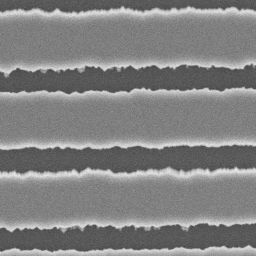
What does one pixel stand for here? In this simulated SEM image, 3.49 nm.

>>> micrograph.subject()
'lines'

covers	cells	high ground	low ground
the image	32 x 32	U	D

DDDDDDDDDDDDDDDDDDDDDDDDDDDDDDDD
DUUUUDDUDDDUUUUUUDUUUUUUUUUUUUUU
UUUUUUUUUUUUUUUUUUUUUUUUUUUUUUUU
UUUUUUUUUUUUUUUUUUUUUUUUUUUUUUUU
UUUUUUUUUUUUUUUUUUUUUUUUUUUUUUUU
UUUUUUUUUUUUUUUUUUUUUUUUUUUUUUUU
UUUUUUUUUUUUUUUUUUUUUUUUUUUUUUUU
UUUUUUUUUUUUUUUUUUUUUUUUUUUUUUUU
UUUUUUUUUUDDDUDDDDDDDDDDDDDDDUDD
DDDDDDDDDDDDDDDDDDDDDDDDDDDDDDDD
DDDDDDDDDDDDDDDDDDDDDDDDDDDDDDDD
DDDDUUDUDDDUUUDUUUUUUUUUUUUUUUUU
UUUUUUUUUUUUUUUUUUUUUUUUUUUUUUUU
UUUUUUUUUUUUUUUUUUUUUUUUUUUUUUUU
UUUUUUUUUUUUUUUUUUUUUUUUUUUUUUUU
UUUUUUUUUUUUUUUUUUUUUUUUUUUUUUUU
UUUUUUUUUUUUUUUUUUUUUUUUUUUUUUUU
UUUUUUUUUUUUUUUUUUUUUUUUUUUUUUUU
UUUDDUDDDUUDUDDDDDDUDDDDDDDDDDDD
DDDDDDDDDDDDDDDDDDDDDDDDDDDDDDDD
DDDDDDDDDDDDDDDDDDDDDDDDDDDDDDDD
DDDDDDDDDUUUUUDDDUUUUUDDUUUUUUUU
UUUUUUUUUUUUUUUUUUUUUUUUUUUUUUUU
UUUUUUUUUUUUUUUUUUUUUUUUUUUUUUUU
UUUUUUUUUUUUUUUUUUUUUUUUUUUUUUUU
UUUUUUUUUUUUUUUUUUUUUUUUUUUUUUUU
UUUUUUUUUUUUUUUUUUUUUUUUUUUUUUUU
UUUUUUUUUUUUUUUUUUUUUUUUUUUUUUUU
DUUDUUUDDDDDDDDDDDDDDDDDDDDDDDDD
DDDDDDDDDDDDDDDDDDDDDDDDDDDDDDDD
DDDDDDDDDDDDDDDDDDDDDDDDDDDDDDDD
UUUUUUUUUUUUUUUUUUUUUUUUUUUUUUUU